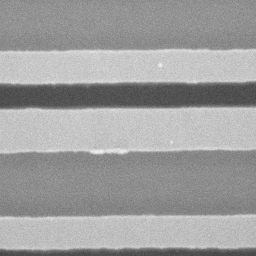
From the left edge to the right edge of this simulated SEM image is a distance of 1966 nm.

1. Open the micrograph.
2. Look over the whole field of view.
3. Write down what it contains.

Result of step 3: lines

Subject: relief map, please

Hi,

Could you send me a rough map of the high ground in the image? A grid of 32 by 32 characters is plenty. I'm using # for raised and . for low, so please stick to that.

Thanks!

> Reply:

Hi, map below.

................................
................................
................................
................................
................................
................................
........######.#################
################################
################################
################################
................................
................................
................................
................................
################################
################################
################################
################################
################################
................................
................................
................................
................................
................................
................................
................................
................................
################################
################################
################################
################################
................................